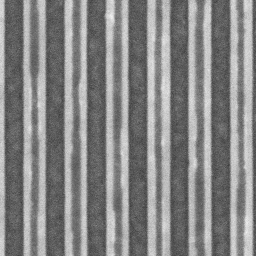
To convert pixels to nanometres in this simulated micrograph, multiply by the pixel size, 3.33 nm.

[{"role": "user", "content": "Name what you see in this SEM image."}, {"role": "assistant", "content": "parallel lines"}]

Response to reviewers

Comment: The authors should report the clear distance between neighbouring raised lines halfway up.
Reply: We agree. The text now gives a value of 82.9 nm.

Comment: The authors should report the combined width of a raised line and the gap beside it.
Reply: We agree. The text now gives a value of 138 nm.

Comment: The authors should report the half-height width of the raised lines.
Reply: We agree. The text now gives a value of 16.2 pixels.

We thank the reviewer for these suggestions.